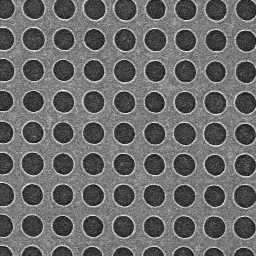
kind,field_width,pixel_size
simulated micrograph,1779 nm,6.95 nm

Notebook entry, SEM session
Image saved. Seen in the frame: a regular array of holes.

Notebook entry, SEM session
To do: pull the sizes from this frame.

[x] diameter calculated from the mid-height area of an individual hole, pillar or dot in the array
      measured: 21.6 px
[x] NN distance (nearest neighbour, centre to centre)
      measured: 30.3 px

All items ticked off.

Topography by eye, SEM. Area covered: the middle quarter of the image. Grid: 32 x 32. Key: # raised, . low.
..###.....###.....###....###....
...##.....##......##.....##.....
...##.....###.....##.....###....
..####....###.....###....###....
#######.#######.##############..
################################
################################
..####...####....####...####....
..###.....###....###.....###....
...##.....##......##.....###....
...##.....###.....##.....###....
..###....####....####....###....
################################
################################
################################
..###....####....####....###....
..###.....###....###.....###....
..###.....##......##.....##.....
..###.....###.....##.....###....
.#####...####....####....###....
################################
################################
.#####..######.#######.######..#
..###....####....####....###....
..##......##......##.....##.....
..###.....##......##.....##.....
..###.....###....###.....###....
.#####..######...####...#####...
################################
################################
.#####...#####..#####...#####..#
..###.....###....###.....###....